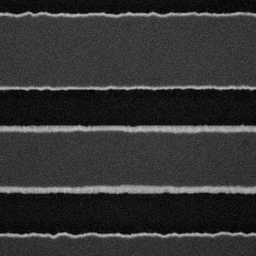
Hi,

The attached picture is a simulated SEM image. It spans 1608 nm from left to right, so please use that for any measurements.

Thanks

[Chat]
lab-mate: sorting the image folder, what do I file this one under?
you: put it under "lines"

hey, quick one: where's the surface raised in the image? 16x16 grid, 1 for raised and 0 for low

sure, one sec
0000000000000000
1111111111111111
1111111111111111
1111111111111111
1111111111111111
1111111111111111
0000000000000000
0000000000000000
1111111111111111
1111111111111111
1111111111111111
1111111111111111
0000000000000000
0000000000000000
0000000000000000
1111111111111111